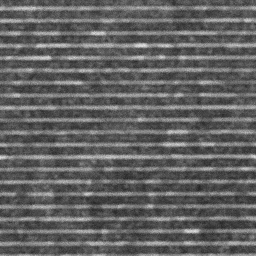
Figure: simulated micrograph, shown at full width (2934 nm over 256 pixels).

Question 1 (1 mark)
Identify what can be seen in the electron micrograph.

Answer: parallel lines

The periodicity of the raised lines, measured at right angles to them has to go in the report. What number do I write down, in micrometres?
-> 0.142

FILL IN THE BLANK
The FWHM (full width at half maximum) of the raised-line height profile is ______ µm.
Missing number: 0.033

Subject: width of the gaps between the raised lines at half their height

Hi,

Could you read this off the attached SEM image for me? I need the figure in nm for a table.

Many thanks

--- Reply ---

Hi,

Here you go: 113